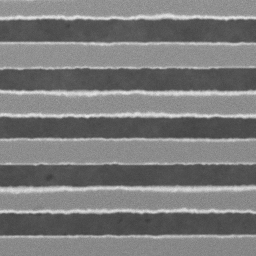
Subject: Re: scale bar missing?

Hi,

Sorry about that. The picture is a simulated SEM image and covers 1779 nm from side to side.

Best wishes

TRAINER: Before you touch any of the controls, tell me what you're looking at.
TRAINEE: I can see lines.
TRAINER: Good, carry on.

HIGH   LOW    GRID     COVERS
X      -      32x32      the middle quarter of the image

XXXXXXXXXXXXXXXXXXXXXXXXXXXXXXXX
--------------------------------
--------------------------------
--------------------------------
--------------------------------
--------------------------------
--------------------------------
XXXXXXXXXXXXXXXXXXXXXXXXXXXXXXXX
XXXXXXXXXXXXXXXXXXXXXXXXXXXXXXXX
XXXXXXXXXXXXXXXXXXXXXXXXXXXXXXXX
XXXXXXXXXXXXXXXXXXXXXXXXXXXXXXXX
XXXXXXXXXXXXXXXXXXXXXXXXXXXXXXXX
XXXXXXXXXXXXXXXXXXXXXXXXXXXXXXXX
--------------------------------
--------------------------------
--------------------------------
--------------------------------
--------------------------------
--------------------------------
XXXXXXXXXXXXXXXXXXXXXXXXXXXXXXXX
XXXXXXXXXXXXXXXXXXXXXXXXXXXXXXXX
XXXXXXXXXXXXXXXXXXXXXXXXXXXXXXXX
XXXXXXXXXXXXXXXXXXXXXXXXXXXXXXXX
XXXXXXXXXXXXXXXXXXXXXXXXXXXXXXXX
XXXXXXXXXXXXXXXXXXXXXXXXXXXXXXXX
--------------------------------
--------------------------------
--------------------------------
--------------------------------
--------------------------------
--------------------------------
XXXXXXXXXXXXXXXXXXXXXXXXXXXXXXXX